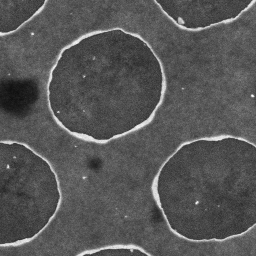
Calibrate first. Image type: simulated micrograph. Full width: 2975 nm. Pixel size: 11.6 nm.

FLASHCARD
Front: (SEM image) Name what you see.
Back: holes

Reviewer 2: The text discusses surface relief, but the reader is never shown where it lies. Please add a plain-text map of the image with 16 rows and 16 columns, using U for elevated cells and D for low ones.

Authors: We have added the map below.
DDUUUUUUUUDDDDDU
DUUUUUUUUUUDDUUU
UUUUUDDDDUUUUUUU
UUUUDDDDDDUUUUUU
UUUDDDDDDDUUUUUU
UUUDDDDDDDUUUUUU
UUUDDDDDDDUUUUUU
UUUUDDDDDUUUUUUU
UUUUUDDUUUUUUUUU
DDUUUUUUUUUDDDDD
DDDUUUUUUUDDDDDD
DDDDUUUUUUDDDDDD
DDDDUUUUUUDDDDDD
DDDUUUUUUUDDDDDD
DDUUUUUUUUUDDDDU
UUUUUUUDDUUUUUUU